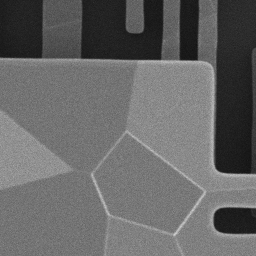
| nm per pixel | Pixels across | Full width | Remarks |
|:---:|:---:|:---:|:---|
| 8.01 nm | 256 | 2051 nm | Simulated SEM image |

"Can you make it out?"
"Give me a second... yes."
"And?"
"wiring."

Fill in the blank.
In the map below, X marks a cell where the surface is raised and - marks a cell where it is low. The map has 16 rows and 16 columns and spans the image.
----------------
----------------
----------------
----------------
XXXXXXXXXXXXX---
XXXXXXXXXXXXX---
XXXXXXXXXXXXX---
XXXXXXXXXXXXX---
XXXXXXXXXXXXX---
XXXXXXXXXXXXX---
XXXXXXXXXXXXXX--
XXXXXXXXXXXXXXXX
XXXXXXXXXXXXXXXX
XXXXXXXXXXXXX---
XXXXXXXXXXXXXX--
XXXXXXXXXXXXXXXX